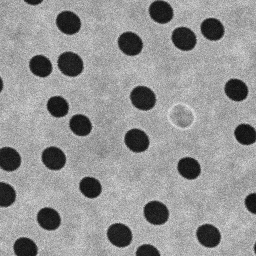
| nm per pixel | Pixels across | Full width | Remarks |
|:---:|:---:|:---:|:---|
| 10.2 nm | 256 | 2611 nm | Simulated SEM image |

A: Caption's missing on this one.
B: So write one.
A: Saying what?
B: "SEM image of a regular array of holes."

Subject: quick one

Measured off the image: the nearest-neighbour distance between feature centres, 0.437 um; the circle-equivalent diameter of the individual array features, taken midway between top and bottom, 248 nanometers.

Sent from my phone